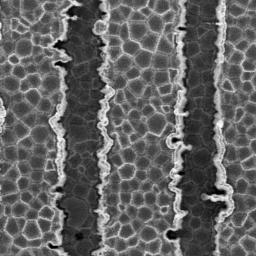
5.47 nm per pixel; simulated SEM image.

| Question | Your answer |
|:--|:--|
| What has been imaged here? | one or a few lines or trenches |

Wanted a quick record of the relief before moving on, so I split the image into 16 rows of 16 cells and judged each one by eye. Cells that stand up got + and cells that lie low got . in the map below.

++++..+++++...++
++++..+++++...++
++++..+++++...++
++++...++++...++
++++..+++++...++
++++...++++..+++
++++..+++++...++
++++..+++++...++
++++..+++++...++
++++..+++++...++
++++..+++++...++
++++..+++++...++
++++..+++++...++
++++..+++++...++
++++..+++++...++
++++..+++++...++